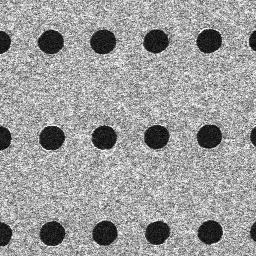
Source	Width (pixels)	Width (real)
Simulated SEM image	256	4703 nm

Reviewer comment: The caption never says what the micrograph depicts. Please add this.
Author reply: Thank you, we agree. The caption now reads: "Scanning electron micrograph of a regular array of holes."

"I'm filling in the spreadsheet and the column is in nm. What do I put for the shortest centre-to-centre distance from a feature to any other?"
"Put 965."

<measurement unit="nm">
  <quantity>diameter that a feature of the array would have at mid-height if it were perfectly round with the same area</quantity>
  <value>466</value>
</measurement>